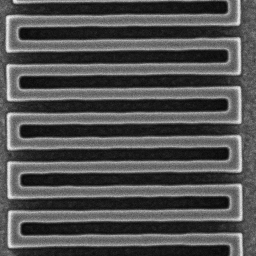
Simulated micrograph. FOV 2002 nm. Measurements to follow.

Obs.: groups of lines, slits or small figures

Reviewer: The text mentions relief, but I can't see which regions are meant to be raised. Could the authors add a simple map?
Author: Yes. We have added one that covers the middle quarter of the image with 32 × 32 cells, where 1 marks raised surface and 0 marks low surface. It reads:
11111111111111111111111111111111
11111111111111111111111111111111
11111111111111111111111000000000
00000000000000000000000000000000
00000000000000000000000000000000
00000000000000000000000000000000
11111111111111111111111111111111
11111111111111111111111111111111
11111111111111111111111111111111
00000000000000000000000000000000
00000000000000000000000000000000
00000000000000000000000000000000
11111111111111111111111111111111
11111111111111111111111111111111
11111111111111111111111111111111
00000000000000000000000000000000
00000000000000000000000000000000
00000000000000000000000000000000
00111111111111111111111111111111
11111111111111111111111111111111
11111111111111111111111111111111
00000000000000000000000000000000
00000000000000000000000000000000
00000000000000000000000000000000
11111111111111111111111111111111
11111111111111111111111111111111
11111111111111111111111111111111
00000000000000000000000000000000
00000000000000000000000000000000
00000000000000000000000000000000
11100000000111111111111111111111
11111111111111111111111111111111